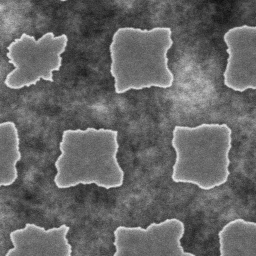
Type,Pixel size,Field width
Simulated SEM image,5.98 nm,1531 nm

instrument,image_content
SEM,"raised bodies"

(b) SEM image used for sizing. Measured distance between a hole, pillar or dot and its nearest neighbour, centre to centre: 0.656 microns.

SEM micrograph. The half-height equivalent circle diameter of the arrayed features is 384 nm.